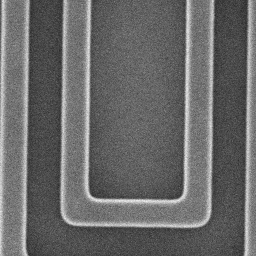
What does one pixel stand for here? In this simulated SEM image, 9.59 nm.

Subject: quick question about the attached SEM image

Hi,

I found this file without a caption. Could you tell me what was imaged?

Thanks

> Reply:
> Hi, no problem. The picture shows groups of lines, slits or small figures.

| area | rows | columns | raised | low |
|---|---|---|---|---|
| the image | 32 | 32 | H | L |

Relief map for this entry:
HHHHLLLLHHHLLLLLLLLLLLLHHHHLLLLH
HHHHLLLLHHHLLLLLLLLLLLLHHHHLLLLH
HHHHLLLLHHHLLLLLLLLLLLLHHHHLLLLH
HHHHLLLLHHHLLLLLLLLLLLLHHHHLLLLH
HHHLLLLLHHHLLLLLLLLLLLLHHHHLLLLH
HHHLLLLLHHHLLLLLLLLLLLLHHHHLLLLH
HHHLLLLLHHHLLLLLLLLLLLLHHHHLLLLH
HHHLLLLLHHHLLLLLLLLLLLLHHHHLLLLH
HHHLLLLLHHHLLLLLLLLLLLLHHHHLLLLH
HHHLLLLLHHHLLLLLLLLLLLLHHHHLLLLH
HHHLLLLLHHHLLLLLLLLLLLLHHHHLLLLH
HHHLLLLLHHHLLLLLLLLLLLLHHHHLLLLH
HHHLLLLLHHHLLLLLLLLLLLLHHHLLLLLH
HHHLLLLLHHHLLLLLLLLLLLLHHHLLLLLH
HHHLLLLLHHHLLLLLLLLLLLLHHHLLLLLH
HHHLLLLLHHHLLLLLLLLLLLLHHHLLLLLH
HHHLLLLLHHHLLLLLLLLLLLLHHHLLLLLH
HHHLLLLLHHHLLLLLLLLLLLLHHHLLLLLH
HHHLLLLLHHHLLLLLLLLLLLLHHHLLLLLH
HHHLLLLLHHHLLLLLLLLLLLLHHHLLLLLH
HHHLLLLLHHHLLLLLLLLLLLLHHHLLLLLH
HHHLLLLLHHHLLLLLLLLLLLLHHHLLLLLH
HHHLLLLLHHHLLLLLLLLLLLLHHHLLLLLH
HHHLLLLLHHHLLLLLLLLLLLLHHHLLLLLH
HHHLLLLLHHHLLLLLLLLLLLLHHHLLLLLH
HHHLLLLLHHHHHHHHHHHHHHHHHHLLLLLH
HHHLLLLLHHHHHHHHHHHHHHHHHHLLLLLH
HHHLLLLLHHHHHHHHHHHHHHHHHHLLLLLH
HHHLLLLLLLLLLLLLLLLLLLLLLLLLLLLH
HHHLLLLLLLLLLLLLLLLLLLLLLLLLLLLH
HHHLLLLLLLLLLLLLLLLLLLLLLLLLLLLH
HHHLLLLLLLLLLLLLLLLLLLLLLLLLLLLH